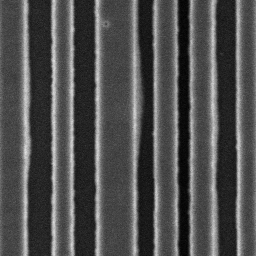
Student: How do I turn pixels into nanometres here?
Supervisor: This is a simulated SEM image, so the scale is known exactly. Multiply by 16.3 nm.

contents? lines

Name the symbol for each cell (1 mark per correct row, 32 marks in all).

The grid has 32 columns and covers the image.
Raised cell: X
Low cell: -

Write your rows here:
XXX----XX---XXXXX--XXX--XXX---XX
XXX----XX---XXXXX--XXX--XXX---XX
XXX----XX---XXXXX--XXX--XXX---XX
XXX----XX---XXXXX--XXX--XXX---XX
XXX----XX---XXXXX--XXX--XXX---XX
XXX----XX---XXXXX--XXX--XXX---XX
XXX----XX---XXXXX--XXX--XXX---XX
XXX----XX---XXXXX--XXX--XXX---XX
XXX----XX---XXXXX--XXX--XXX---XX
XXX----XX---XXXXX--XXX--XXX---XX
XXX----XX---XXXXX--XXX--XXX---XX
XXX----XX---XXXXX--XXX--XXX---XX
XXX----XX---XXXXX--XXX--XXX---XX
XXX----XX---XXXXX--XXX--XXX---XX
XXX----XX---XXXXX--XXX--XXX---XX
XXX----XX---XXXXX--XXX--XXX---XX
XXX----XX---XXXXX--XXX--XXX---XX
XXX----XX---XXXXX--XXX--XXX---XX
XXX----XX---XXXXX--XXX--XXX---XX
XXX----XX---XXXXX--XXX--XXX---XX
XXX----XX---XXXXX--XXX--XXX---XX
XXX----XX---XXXXX--XXX--XXX---XX
XXX----XX---XXXXX--XXX--XXX---XX
XXX----XX---XXXXX--XXX--XXX---XX
XXX----XX---XXXXX--XXX--XXX---XX
XXX----XX---XXXXX--XXX--XXX---XX
XXX----XX---XXXXX--XXX--XXX---XX
XXX----XX---XXXXX--XXX--XXX---XX
XXX----XX---XXXXX--XXX--XXX---XX
XXX----XX---XXXXX--XXX--XXX---XX
XXX----XX---XXXXX--XXX--XXX---XX
XXX----XX---XXXXX--XXX--XXX---XX